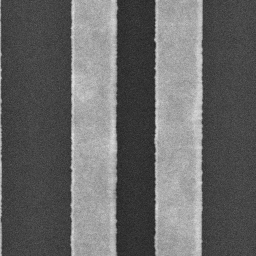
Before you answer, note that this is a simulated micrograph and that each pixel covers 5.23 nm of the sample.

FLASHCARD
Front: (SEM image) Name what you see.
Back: lines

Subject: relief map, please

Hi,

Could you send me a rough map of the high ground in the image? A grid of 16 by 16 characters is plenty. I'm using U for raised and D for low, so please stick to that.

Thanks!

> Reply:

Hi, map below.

DDDDUUUDDDUUUDDD
DDDDUUUDDDUUUDDD
DDDDUUUDDDUUUDDD
DDDDUUUDDDUUUDDD
DDDDUUUDDDUUUDDD
DDDDUUUDDDUUUDDD
DDDDUUUDDDUUUDDD
DDDDUUUDDDUUUDDD
DDDDUUUDDDUUUDDD
DDDDUUUDDDUUUDDD
DDDDUUUDDDUUUDDD
DDDDUUUDDDUUUDDD
DDDDUUUDDDUUUDDD
DDDDUUUDDDUUUDDD
DDDDUUUDDDUUUDDD
DDDDUUUDDDUUUDDD